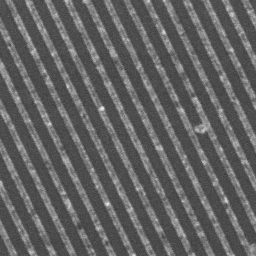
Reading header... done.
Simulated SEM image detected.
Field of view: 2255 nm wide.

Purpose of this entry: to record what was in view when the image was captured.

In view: parallel lines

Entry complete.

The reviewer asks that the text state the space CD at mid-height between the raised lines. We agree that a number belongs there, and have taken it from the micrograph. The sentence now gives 115 nanometers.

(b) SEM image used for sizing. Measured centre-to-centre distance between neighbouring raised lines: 156 nanometers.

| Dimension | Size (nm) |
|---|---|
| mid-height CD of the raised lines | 45.5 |